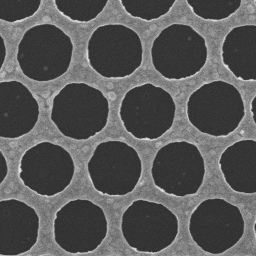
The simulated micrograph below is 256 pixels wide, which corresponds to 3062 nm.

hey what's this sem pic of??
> a regular array of holes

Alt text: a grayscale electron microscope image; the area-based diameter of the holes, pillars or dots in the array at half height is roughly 652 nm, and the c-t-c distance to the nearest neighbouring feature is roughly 789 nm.